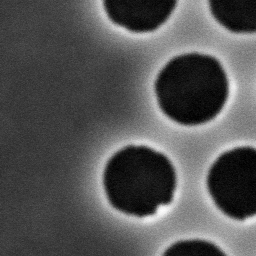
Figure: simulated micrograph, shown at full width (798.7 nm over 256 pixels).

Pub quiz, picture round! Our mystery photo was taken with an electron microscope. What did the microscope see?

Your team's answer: holes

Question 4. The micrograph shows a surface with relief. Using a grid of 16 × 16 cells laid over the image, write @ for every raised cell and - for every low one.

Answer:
@@@@@@@----@@---
@@@@@@@---@@@@--
@@@@@@@@@@@@@@@@
@@@@@@@@@@@--@@@
@@@@@@@@@@----@@
@@@@@@@@@@----@@
@@@@@@@@@@----@@
@@@@@@@@@@@--@@@
@@@@@@@@@@@@@@@@
@@@@@@@---@@@@--
@@@@@@@----@@---
@@@@@@-----@@---
@@@@@@@----@@---
@@@@@@@@-@@@@@--
@@@@@@@@@@@@@@@@
@@@@@@@@@@@---@@